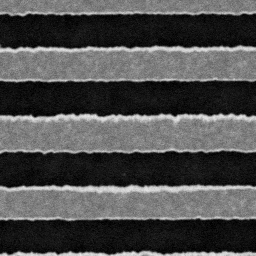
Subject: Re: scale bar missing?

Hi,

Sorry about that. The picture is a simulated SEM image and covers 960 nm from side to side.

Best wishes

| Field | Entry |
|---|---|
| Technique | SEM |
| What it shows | lines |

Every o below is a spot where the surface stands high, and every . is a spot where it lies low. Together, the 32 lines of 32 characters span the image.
oooooooooooooooooooooooooooooooo
oooooooooooooooooooooooooooooooo
................................
................................
................................
................................
oooooooooooooooooooooooooooooooo
oooooooooooooooooooooooooooooooo
oooooooooooooooooooooooooooooooo
oooooooooooooooooooooooooooooooo
................................
................................
................................
................................
...o...ooooo..o.ooooooooooooooo.
oooooooooooooooooooooooooooooooo
oooooooooooooooooooooooooooooooo
oooooooooooooooooooooooooooooooo
oooooooooooooooooooooooooooooooo
................................
................................
................................
................................
oooooooooooooooooooooooooooooooo
oooooooooooooooooooooooooooooooo
oooooooooooooooooooooooooooooooo
oooooooooooooooooooooooooooooooo
................................
................................
................................
................................
..................o.............